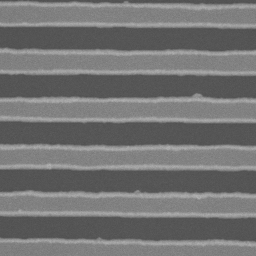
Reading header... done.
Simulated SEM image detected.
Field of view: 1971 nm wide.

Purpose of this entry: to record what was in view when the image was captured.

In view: lines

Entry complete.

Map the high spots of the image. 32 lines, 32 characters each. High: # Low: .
####################............
################################
################################
................................
................................
................................
################################
################################
################################
................................
................................
................................
################################
################################
################################
................................
................................
................................
################################
################################
################################
................................
................................
................................
################################
################################
################################
................................
................................
................................
################################
################################